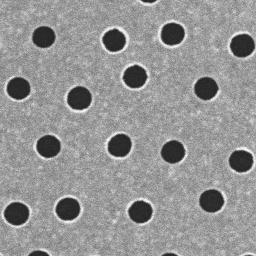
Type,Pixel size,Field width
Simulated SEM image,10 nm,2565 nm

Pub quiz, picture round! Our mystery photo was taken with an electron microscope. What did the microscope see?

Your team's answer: a regular array of holes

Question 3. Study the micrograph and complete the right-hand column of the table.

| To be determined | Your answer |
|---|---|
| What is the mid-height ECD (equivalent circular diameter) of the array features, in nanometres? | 238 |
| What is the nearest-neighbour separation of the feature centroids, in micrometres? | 0.55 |